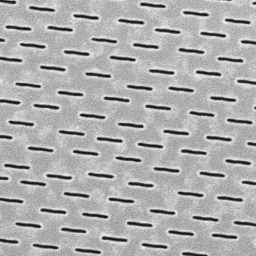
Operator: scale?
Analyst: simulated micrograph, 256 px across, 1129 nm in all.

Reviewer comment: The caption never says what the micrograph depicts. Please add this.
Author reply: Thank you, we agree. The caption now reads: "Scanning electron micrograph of a regular array of holes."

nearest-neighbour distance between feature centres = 117 nanometres